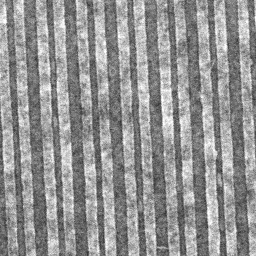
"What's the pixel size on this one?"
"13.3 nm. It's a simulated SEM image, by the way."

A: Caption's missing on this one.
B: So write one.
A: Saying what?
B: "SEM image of parallel lines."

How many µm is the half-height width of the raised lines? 0.123